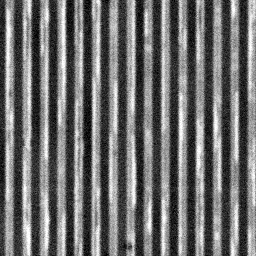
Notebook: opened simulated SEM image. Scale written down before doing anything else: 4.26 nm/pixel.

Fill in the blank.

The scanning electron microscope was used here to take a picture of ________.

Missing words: parallel lines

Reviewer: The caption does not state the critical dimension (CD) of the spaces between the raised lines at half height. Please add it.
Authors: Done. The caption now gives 0.0421 micrometres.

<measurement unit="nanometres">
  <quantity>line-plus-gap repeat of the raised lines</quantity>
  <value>73.8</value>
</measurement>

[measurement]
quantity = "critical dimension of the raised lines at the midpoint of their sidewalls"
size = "30.4 nm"